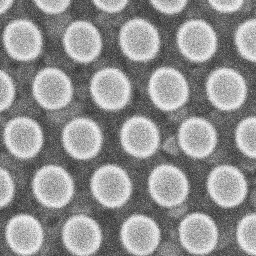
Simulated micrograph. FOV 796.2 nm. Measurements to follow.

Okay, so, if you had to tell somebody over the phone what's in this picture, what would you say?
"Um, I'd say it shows a regular array of raised bodies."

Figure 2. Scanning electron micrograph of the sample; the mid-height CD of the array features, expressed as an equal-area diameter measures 37 px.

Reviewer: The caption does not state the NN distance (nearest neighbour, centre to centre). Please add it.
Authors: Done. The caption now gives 175 nanometres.